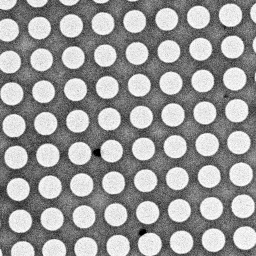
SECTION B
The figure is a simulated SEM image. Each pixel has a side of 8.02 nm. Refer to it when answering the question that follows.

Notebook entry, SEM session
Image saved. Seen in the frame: an array of small figures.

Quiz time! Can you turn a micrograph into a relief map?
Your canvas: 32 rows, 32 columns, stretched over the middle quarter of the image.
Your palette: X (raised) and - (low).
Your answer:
-XXX------X---------------------
--------------------------------
-------------------------XXX----
----------XX-----XXXX---XXXXX---
-XXXX---XXXXX---XXXXX---XXXXX---
XXXXX---XXXXX---XXXXX---XXXXX---
XXXXXX--XXXXX---XXXXX----XXXX---
XXXXX----XXXX----XXX------X-----
-XXXX---------------------------
--------------------------------
--------------------------XXX---
----------XXX----XXXX----XXXXX--
-XXXX----XXXXX---XXXXX---XXXXX--
-XXXXX---XXXXX---XXXXX---XXXXX--
-XXXXX---XXXXX---XXXXX---XXXXX--
-XXXXX---XXXX-----XXX-----------
--XXX---------------------------
--------------------------------
--------------------------XXX---
-----------XX-----XXXX---XXXXX--
--XXXX----XXXX---XXXXX---XXXXX--
-XXXXXX--XXXXX---XXXXXX--XXXXX--
-XXXXXX--XXXXX---XXXXX----XXXX--
-XXXXX----XXXX----XXX-----------
--XXXX--------------------------
--------------------------------
---------------------------XXX--
-----------XXX----XXXXX---XXXXX-
--XXXXX---XXXXX---XXXXX---XXXXX-
--XXXXX---XXXXX---XXXXX---XXXXX-
--XXXXX---XXXXX---XXXXX---XXXX--
--XXXXX---XXXX-----XXX----------